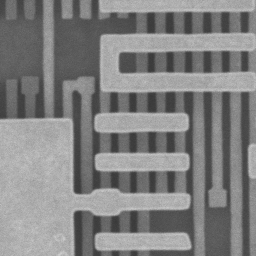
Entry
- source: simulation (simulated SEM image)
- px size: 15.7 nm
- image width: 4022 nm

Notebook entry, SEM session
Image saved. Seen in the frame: wiring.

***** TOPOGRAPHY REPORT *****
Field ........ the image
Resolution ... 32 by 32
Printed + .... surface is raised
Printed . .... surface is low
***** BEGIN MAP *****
.............+++++++++++++++++++
................................
................................
................................
.............+++++++++++++++++++
.............+++++++++++++++++++
.............++.................
.............++.................
.............++.................
.............+++++++++++++++++++
.............+++++++++++++++++++
...............+++..............
................................
................................
............+++++++++++.........
+++++++++...++++++++++++........
+++++++++....+++................
+++++++++.......................
+++++++++......................+
+++++++++...+++++++++++........+
+++++++++...++++++++++++.......+
+++++++++......................+
+++++++++.......................
+++++++++.......................
++++++++++++++++++++++++........
++++++++++++++++++++++++........
+++++++++..++++.................
+++++++++.......................
+++++++++.......................
+++++++++...++++++++++++........
+++++++++...++++++++++++........
+++++++++.......................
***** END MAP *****